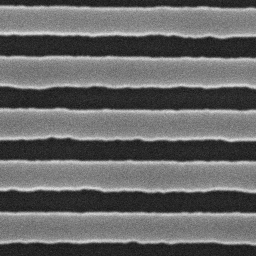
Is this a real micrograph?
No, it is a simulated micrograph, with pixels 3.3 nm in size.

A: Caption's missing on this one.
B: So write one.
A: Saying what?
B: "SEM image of lines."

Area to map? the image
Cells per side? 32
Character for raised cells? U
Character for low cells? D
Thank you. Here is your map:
DDDDDDDDDDDDDDDDDDDDDDDDDDDDDDDD
UUUUUUUUUUUUUUUUUUUUUUUUUUUUUUUU
UUUUUUUUUUUUUUUUUUUUUUUUUUUUUUUU
UUUUUUUUUUUUUUUUUUUUUUUUUUUUUUUU
DDDDDDDDDDDDDDDDDDDDDDUUUUUUUUUU
DDDDDDDDDDDDDDDDDDDDDDDDDDDDDDDD
DDDDDDDDDDDDDDDDDDDDDDDDDDDDDDDD
UUUUUUUUUUUUUUUUUUUUUUUUUUUUUUUU
UUUUUUUUUUUUUUUUUUUUUUUUUUUUUUUU
UUUUUUUUUUUUUUUUUUUUUUUUUUUUUUUU
UUUUUUUUUUUUUUUUUUUUUUUUUUUUUUUU
DDDDDDDDDDDDDDDDDDDDDDDDDDDDDDDD
DDDDDDDDDDDDDDDDDDDDDDDDDDDDDDDD
DDDDDDDDDDDDDDDDDDDDDDDDDDDDDDDD
UUUUUUUUUUUUUUUUUUUUUUUUUUUUUUUU
UUUUUUUUUUUUUUUUUUUUUUUUUUUUUUUU
UUUUUUUUUUUUUUUUUUUUUUUUUUUUUUUU
DDDDDDDDDDDDDDDDDDUDDUDDDDDDUUUD
DDDDDDDDDDDDDDDDDDDDDDDDDDDDDDDD
DDDDDDDDDDDDDDDDDDDDDDDDDDDDDDDD
UUUUUUUUUUUUUUUUUUUUUUUUUUUUUUUU
UUUUUUUUUUUUUUUUUUUUUUUUUUUUUUUU
UUUUUUUUUUUUUUUUUUUUUUUUUUUUUUUU
UUUUUUUUUUUUUUUUUUUUUUUUUUUUUUUU
DDDDDDDDDDDDDDDDDDDDDDDDDDDDDDDD
DDDDDDDDDDDDDDDDDDDDDDDDDDDDDDDD
DDDDDDDDDDDDDDDDDDDDDDDDDDDDDDDD
UUUUUUUUUUUUUUUUUUUUUUUUUUUUUUUU
UUUUUUUUUUUUUUUUUUUUUUUUUUUUUUUU
UUUUUUUUUUUUUUUUUUUUUUUUUUUUUUUU
DDDDDDDDDDDDDDDDDDDDDDDDDDDDDDDU
DDDDDDDDDDDDDDDDDDDDDDDDDDDDDDDD